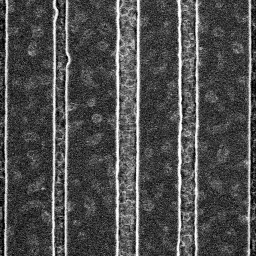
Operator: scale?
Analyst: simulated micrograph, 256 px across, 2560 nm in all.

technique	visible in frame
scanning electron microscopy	one or a few lines or trenches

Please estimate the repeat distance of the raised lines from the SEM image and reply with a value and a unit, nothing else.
643 nanometres